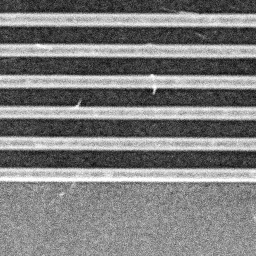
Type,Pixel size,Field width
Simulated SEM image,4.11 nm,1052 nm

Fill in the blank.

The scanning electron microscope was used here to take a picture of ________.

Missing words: parallel lines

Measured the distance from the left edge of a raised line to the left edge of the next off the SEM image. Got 127 nm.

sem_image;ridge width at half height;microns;0.0468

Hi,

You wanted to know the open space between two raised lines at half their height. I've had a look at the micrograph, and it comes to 0.0782 um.